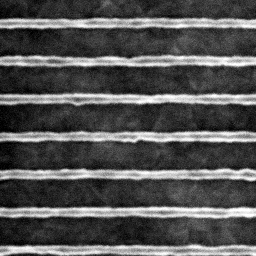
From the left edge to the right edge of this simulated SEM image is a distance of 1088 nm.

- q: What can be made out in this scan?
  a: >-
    parallel lines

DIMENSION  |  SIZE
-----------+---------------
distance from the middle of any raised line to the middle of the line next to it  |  0.161 micrometres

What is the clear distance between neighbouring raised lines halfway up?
30.5 px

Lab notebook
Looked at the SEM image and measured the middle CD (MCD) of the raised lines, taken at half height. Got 0.0308 um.